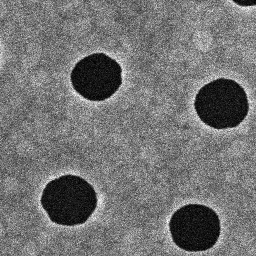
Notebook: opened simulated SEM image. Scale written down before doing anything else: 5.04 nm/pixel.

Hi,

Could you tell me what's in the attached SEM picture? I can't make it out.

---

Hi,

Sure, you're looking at holes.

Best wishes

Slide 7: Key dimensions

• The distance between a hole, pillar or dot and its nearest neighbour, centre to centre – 0.636 µm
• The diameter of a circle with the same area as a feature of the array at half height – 260 nm